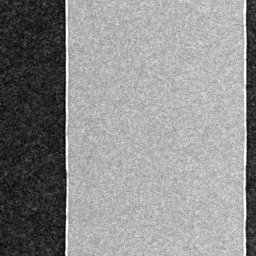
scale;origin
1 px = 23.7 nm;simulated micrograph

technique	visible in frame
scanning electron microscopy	one or a few lines or trenches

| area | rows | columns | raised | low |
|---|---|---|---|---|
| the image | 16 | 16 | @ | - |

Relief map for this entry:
----@@@@@@@@@@@-
----@@@@@@@@@@@-
----@@@@@@@@@@@-
----@@@@@@@@@@@-
----@@@@@@@@@@@-
----@@@@@@@@@@@-
----@@@@@@@@@@@-
----@@@@@@@@@@@-
----@@@@@@@@@@@-
----@@@@@@@@@@@-
----@@@@@@@@@@@-
----@@@@@@@@@@@-
----@@@@@@@@@@@-
----@@@@@@@@@@@-
----@@@@@@@@@@@-
----@@@@@@@@@@@-